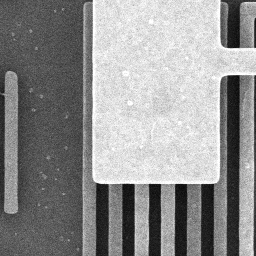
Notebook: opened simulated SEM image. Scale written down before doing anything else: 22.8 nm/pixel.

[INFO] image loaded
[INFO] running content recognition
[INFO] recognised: wiring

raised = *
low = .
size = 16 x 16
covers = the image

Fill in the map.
......********..
......********..
......********..
......**********
......**********
......********..
......********..
......********..
......********..
......********..
......********..
................
................
................
................
................